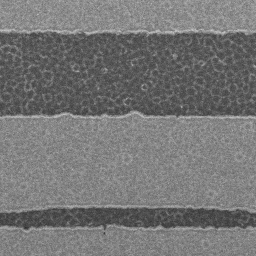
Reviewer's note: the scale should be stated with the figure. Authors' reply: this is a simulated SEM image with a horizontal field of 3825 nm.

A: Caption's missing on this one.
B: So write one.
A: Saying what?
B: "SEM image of one or a few lines or trenches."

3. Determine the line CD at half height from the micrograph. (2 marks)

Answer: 1360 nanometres